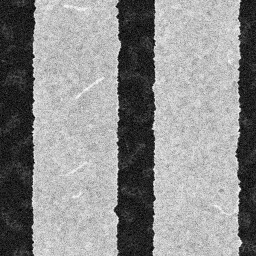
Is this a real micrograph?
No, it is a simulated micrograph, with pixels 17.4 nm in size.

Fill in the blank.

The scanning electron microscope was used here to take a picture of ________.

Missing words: one or a few lines or trenches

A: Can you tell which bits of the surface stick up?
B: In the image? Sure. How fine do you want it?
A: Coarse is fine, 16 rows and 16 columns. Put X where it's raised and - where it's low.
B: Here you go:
--XXXXX---XXXXX-
--XXXXX---XXXXX-
--XXXXX---XXXXX-
--XXXXX---XXXXX-
--XXXXX---XXXXX-
--XXXXX---XXXXX-
--XXXXX---XXXXX-
--XXXXX---XXXXX-
--XXXXX---XXXXX-
--XXXXX---XXXXX-
--XXXXX---XXXXX-
--XXXXX---XXXXX-
--XXXXX---XXXXX-
--XXXXX---XXXXX-
--XXXXX---XXXXX-
--XXXXX---XXXXX-